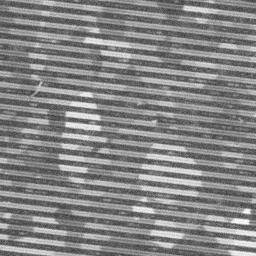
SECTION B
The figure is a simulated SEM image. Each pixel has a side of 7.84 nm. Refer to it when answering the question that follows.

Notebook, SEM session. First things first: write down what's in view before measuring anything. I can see parallel lines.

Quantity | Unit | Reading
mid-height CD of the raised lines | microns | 0.0292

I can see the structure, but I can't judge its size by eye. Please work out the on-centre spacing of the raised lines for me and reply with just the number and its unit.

84.7 nanometres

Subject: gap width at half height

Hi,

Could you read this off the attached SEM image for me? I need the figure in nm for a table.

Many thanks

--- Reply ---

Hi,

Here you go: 57.3